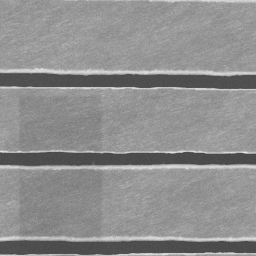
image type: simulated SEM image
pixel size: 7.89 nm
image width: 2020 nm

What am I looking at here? lines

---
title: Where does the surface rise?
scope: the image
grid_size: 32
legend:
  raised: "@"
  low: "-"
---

@@@@@@@@@@@@@@@@@@@@@@@@@@@@@@@@
@@@@@@@@@@@@@@@@@@@@@@@@@@@@@@@@
@@@@@@@@@@@@@@@@@@@@@@@@@@@@@@@@
@@@@@@@@@@@@@@@@@@@@@@@@@@@@@@@@
@@@@@@@@@@@@@@@@@@@@@@@@@@@@@@@@
@@@@@@@@@@@@@@@@@@@@@@@@@@@@@@@@
@@@@@@@@@@@@@@@@@@@@@@@@@@@@@@@@
@@@@@@@@@@@@@@@@@@@@@@@@@@@@@@@@
@@@@@@@@@@@@@@@@@@@@@@@@@@@@@@@@
--------------------------------
--------------------------------
@@@@@@@@@@@@@@@@@@@@@@@@@@@@@@@@
@@@@@@@@@@@@@@@@@@@@@@@@@@@@@@@@
@@@@@@@@@@@@@@@@@@@@@@@@@@@@@@@@
@@@@@@@@@@@@@@@@@@@@@@@@@@@@@@@@
@@@@@@@@@@@@@@@@@@@@@@@@@@@@@@@@
@@@@@@@@@@@@@@@@@@@@@@@@@@@@@@@@
@@@@@@@@@@@@@@@@@@@@@@@@@@@@@@@@
@@@@@@@@@@@@@@@@@@@@@@@@@@@@@@@@
--------------------------------
--------------------------------
@@@@@@@@@@@@@@@@@@@@@@@@@@@@@@@@
@@@@@@@@@@@@@@@@@@@@@@@@@@@@@@@@
@@@@@@@@@@@@@@@@@@@@@@@@@@@@@@@@
@@@@@@@@@@@@@@@@@@@@@@@@@@@@@@@@
@@@@@@@@@@@@@@@@@@@@@@@@@@@@@@@@
@@@@@@@@@@@@@@@@@@@@@@@@@@@@@@@@
@@@@@@@@@@@@@@@@@@@@@@@@@@@@@@@@
@@@@@@@@@@@@@@@@@@@@@@@@@@@@@@@@
@@@@@@@@@@@@@@@@@@@@@@@@@@@@@@@@
--------------------------------
--------------------------------